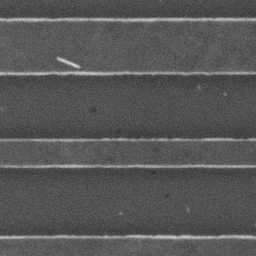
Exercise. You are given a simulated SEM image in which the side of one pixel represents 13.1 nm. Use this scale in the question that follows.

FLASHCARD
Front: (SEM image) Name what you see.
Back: lines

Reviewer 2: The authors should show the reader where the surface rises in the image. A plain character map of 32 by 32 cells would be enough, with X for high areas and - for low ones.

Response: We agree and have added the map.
--------------------------------
--------------------------------
XXXXXXXXXXXXXXXXXXXXXXXXXXXXXXXX
XXXXXXXXXXXXXXXXXXXXXXXXXXXXXXXX
XXXXXXXXXXXXXXXXXXXXXXXXXXXXXXXX
XXXXXXXXXXXXXXXXXXXXXXXXXXXXXXXX
XXXXXXXXXXXXXXXXXXXXXXXXXXXXXXXX
XXXXXXXXXXXXXXXXXXXXXXXXXXXXXXXX
XXXXXXXXXXXXXXXXXXXXXXXXXXXXXXXX
--------------------------------
--------------------------------
--------------------------------
--------------------------------
--------------------------------
--------------------------------
--------------------------------
--------------------------------
--------------XX-----XX--XXXX--X
XXXXXXXXXXXXXXXXXXXXXXXXXXXXXXXX
XXXXXXXXXXXXXXXXXXXXXXXXXXXXXXXX
XXXXXXXXXXXXXXXXXXXXXXXXXXXXXXXX
--------------------------------
--------------------------------
--------------------------------
--------------------------------
--------------------------------
--------------------------------
--------------------------------
--------------------------------
--------------------------------
XXXXXXXXXXXXXXXXXXXXXXXXXXXXXXXX
XXXXXXXXXXXXXXXXXXXXXXXXXXXXXXXX